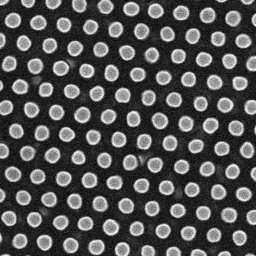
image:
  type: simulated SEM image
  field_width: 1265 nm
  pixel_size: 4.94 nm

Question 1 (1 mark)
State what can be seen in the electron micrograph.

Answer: a regular array of raised bodies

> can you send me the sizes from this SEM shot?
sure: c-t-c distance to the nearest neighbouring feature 0.122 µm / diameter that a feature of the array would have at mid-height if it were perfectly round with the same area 0.069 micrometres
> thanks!